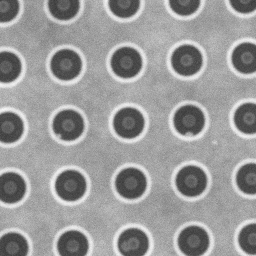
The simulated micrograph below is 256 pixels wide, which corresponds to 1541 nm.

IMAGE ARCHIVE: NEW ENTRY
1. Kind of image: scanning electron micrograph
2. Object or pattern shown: an array of small figures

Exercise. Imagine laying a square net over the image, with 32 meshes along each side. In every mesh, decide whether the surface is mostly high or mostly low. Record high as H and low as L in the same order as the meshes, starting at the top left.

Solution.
LLLHHHLLLLHHHLLLLLHHHLLLLHHHHLLL
LLLHHHLLLLHHHHLLLHHHHLLLLHHHHLLL
LLHHHHHLLHHHHHHHHHHHHHHHHHHHHHHH
HHHHHHHHHHHHHHHHHHHHHHHHHHHHHHHH
HHHHHHHHHHHHHHHHHHHHHHHHHHHHHHHH
HHHHHHHHHHHHHHHHHHHHHHLLHHHHHHLL
LLHHHHHLLLHHHHLLLLHHHLLLLHHHHLLL
LLLHHHLLLLHHHHLLLLHHHLLLLLHHHLLL
LLLHHHLLLLHHHHLLLLHHHLLLLHHHHLLL
LLLHHHHLLLHHHHLLLHHHHHLLHHHHHHHH
LHHHHHHHHHHHHHHHHHHHHHHHHHHHHHHH
HHHHHHHHHHHHHHHHHHHHHHHHHHHHHHHH
HHHHHHHHHHHHHHHHHHHHHHHHHHHHHHHH
HHHHHHHHLHHHHHHLLHHHHHLLLHHHHLLL
LLLHHHHLLLHHHHLLLLHHHHLLLLHHHLLL
LLLHHHLLLLLHHHLLLLHHHHLLLLHHHLLL
LLLHHHLLLLLHHHLLLLHHHHLLLHHHHHLL
LLHHHHHLLLHHHHHHLHHHHHHHHHHHHHHH
HHHHHHHHHHHHHHHHHHHHHHHHHHHHHHHH
HHHHHHHHHHHHHHHHHHHHHHHHHHHHHHHH
HHHHHHHHHHHHHHHHHHHHHHHHHHHHHHLL
LLHHHHHHLLHHHHHLLLHHHHLLLLHHHLLL
LLLHHHHLLLLHHHLLLLLHHHLLLLHHHLLL
LLLHHHHLLLLHHHLLLLHHHHLLLLHHHHLL
LLLHHHHLLLLHHHHLLLHHHHHLLHHHHHHL
LLHHHHHHHHHHHHHHHHHHHHHHHHHHHHHH
HHHHHHHHHHHHHHHHHHHHHHHHHHHHHHHH
HHHHHHHHHHHHHHHHHHHHHHHHHHHHHHHH
HHHHHHHHHHHHHHHHLLHHHHHLLLHHHHLL
LLLHHHHLLLLHHHHLLLLHHHLLLLHHHHLL
LLLLHHHLLLLHHHLLLLLHHHLLLLHHHHLL
LLLLHHHLLLLHHHHLLLLHHHLLLLHHHHLL